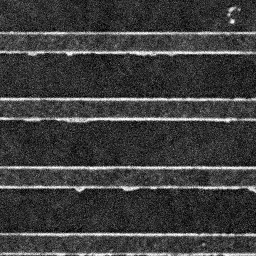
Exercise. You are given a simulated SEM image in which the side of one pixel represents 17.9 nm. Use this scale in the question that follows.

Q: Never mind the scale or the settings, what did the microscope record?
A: lines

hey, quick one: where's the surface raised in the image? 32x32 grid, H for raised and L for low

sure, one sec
LLLLLLLLLLLLLLLLLLLLLLLLLLLLLLLL
LLLLLLLLLLLLLLLLLLLLLLLLLLLLLLLL
LLLLLLLLLLLLLLLLLLLLLLLLLLLLLLLL
LLLLLLLLLLLLLLLLLLLLLLLLLLLLLLLL
HHHHHHHHHHHHHHHHHHHHHHHHHHHHHHHH
HHHHHHHHHHHHHHHHHHHHHHHHHHHHHHHH
HHHHHHHHHHHHHHHHHHHHHHHHHHHHHHHH
LLLLLLLLLLLLLLLLLLLLLLLLLLLLLLLL
LLLLLLLLLLLLLLLLLLLLLLLLLLLLLLLL
LLLLLLLLLLLLLLLLLLLLLLLLLLLLLLLL
LLLLLLLLLLLLLLLLLLLLLLLLLLLLLLLL
LLLLLLLLLLLLLLLLLLLLLLLLLLLLLLLL
HHHHHHHHHHHHHHHHHHHHHHHHHHHHHHHH
HHHHHHHHHHHHHHHHHHHHHHHHHHHHHHHH
HHHHHHHHHHHHHHHHHHHHHHHHHHHHHHHH
LLLLLLLLLLLLLLLLLLLLLLLLLLLLLLLL
LLLLLLLLLLLLLLLLLLLLLLLLLLLLLLLL
LLLLLLLLLLLLLLLLLLLLLLLLLLLLLLLL
LLLLLLLLLLLLLLLLLLLLLLLLLLLLLLLL
LLLLLLLLLLLLLLLLLLLLLLLLLLLLLLLL
LLLLLLLLLLLLLLLLLLLLLLLLLLLLLLLL
HHHHHHHHHHHHHHHHHHHHHHHHHHHHHHHH
HHHHHHHHHHHHHHHHHHHHHHHHHHHHHHHH
LLLLLLLLLLLLLLLLLLLLLLLLLLLLLLLH
LLLLLLLLLLLLLLLLLLLLLLLLLLLLLLLL
LLLLLLLLLLLLLLLLLLLLLLLLLLLLLLLL
LLLLLLLLLLLLLLLLLLLLLLLLLLLLLLLL
LLLLLLLLLLLLLLLLLLLLLLLLLLLLLLLL
LLLLLLLLLLLLLLLLLLLLLLLLLLLLLLLL
HHHHHHHHHHHHHHHHHHHHHHHHHHHHHHHH
HHHHHHHHHHHHHHHHHHHHHHHHHHHHHHHH
HHHHHHHHHHHHHHHHHHHHHHHHHHHHHHHH